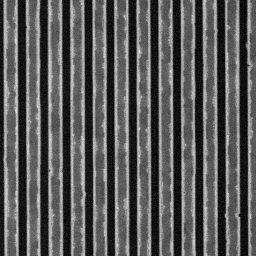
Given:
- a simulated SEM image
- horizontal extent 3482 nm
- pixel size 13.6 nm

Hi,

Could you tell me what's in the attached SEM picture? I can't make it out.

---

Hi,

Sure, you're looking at parallel lines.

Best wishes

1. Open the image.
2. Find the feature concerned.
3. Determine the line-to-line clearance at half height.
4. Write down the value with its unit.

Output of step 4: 10.8 pixels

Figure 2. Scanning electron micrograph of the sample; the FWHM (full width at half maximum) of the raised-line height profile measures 160 nm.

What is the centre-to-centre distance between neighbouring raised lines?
301 nm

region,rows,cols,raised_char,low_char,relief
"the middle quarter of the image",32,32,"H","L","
LLHHHLLLHHLLLHHHLLLHHLLLHHHLLLHH
LLHHHLLLHHLLLHHHLLLHHLLLHHHLLLHH
LLHHHLLLHHLLLHHHLLLHHLLLHHHLLLHH
LLHHHLLLHHLLLHHHLLLHHLLLHHHLLLHH
LLHHHLLLHHLLLHHHLLLHHLLLHHHLLLHH
LLHHHLLLHHLLLHHHLLLHHLLLHHHLLLHH
LLHHHLLLHHLLLHHHLLLHHLLLHHHLLLHH
LLHHHLLLHHLLLHHHLLLHHLLLHHHLLLHH
LLHHHLLLHHLLLHHHLLLHHLLLHHHLLLHH
LLHHHLLLHHLLLHHHLLLHHLLLHHHLLLHH
LLHHHLLLHHLLLHHHLLLHHLLLHHHLLLHH
LLHHHLLLHHLLLHHHLLLHHLLLHHHLLLHH
LLHHHLLLHHLLLHHHLLLHHLLLHHHLLLHH
LLHHHLLLHHLLLHHHLLLHHLLLHHHLLLHH
LLHHHLLLHHLLLHHHLLLHHLLLHHHLLLHH
LLHHHLLLHHLLLHHHLLLHHLLLHHHLLLHH
LLHHHLLLHHLLLHHHLLLHHLLLHHHLLLHH
LLHHHLLLHHLLLHHHLLLHHLLLHHHLLLHH
LLHHHLLLHHLLLHHHLLLHHLLLHHHLLLHH
LLHHHLLLHHLLLHHHLLLHHLLLHHHLLLHH
LLHHHLLLHHLLLHHHLLLHHLLLHHHLLLHH
LLHHHLLLHHLLLHHHLLLHHLLLHHHLLLHH
LLHHHLLLHHLLLHHHLLLHHLLLHHHLLLHH
LLHHHLLLHHLLLHHHLLLHHLLLHHHLLLHH
LLHHHLLLHHLLLHHHLLLHHLLLHHHLLLHH
LLHHHLLLHHLLLHHHLLLHHLLLHHHLLLHH
LLHHHLLLHHLLLHHHLLLHHLLLHHHLLLHH
LLHHHLLLHHLLLHHHLLLHHLLLHHHLLLHH
LLHHHLLLHHLLLHHHLLLHHLLLHHHLLLHH
LLHHHLLLHHLLLHHHLLLHHLLLHHHLLLHH
LLHHHLLLHHLLLHHHLLLHHLLLHHHLLLHH
LLHHHLLLHHLLLHHHLLLHHLLLHHHLLLHH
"